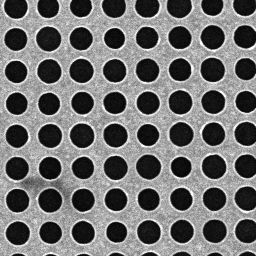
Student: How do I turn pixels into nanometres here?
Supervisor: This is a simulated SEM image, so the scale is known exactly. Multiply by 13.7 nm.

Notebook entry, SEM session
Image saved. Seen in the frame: a regular array of holes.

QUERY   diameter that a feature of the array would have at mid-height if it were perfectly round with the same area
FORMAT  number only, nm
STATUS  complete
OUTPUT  318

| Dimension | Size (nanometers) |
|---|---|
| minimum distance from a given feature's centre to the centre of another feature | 439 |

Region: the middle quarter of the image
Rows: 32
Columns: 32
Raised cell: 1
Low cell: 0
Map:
11000001110000011100000011000000
10000001110000001100000011000000
10000001110000001100000011000000
11000001110000011110000111100001
11100011111100111111001111111111
11111111111111111111111111111111
11111111111111111111111111111111
11100011111000111110000111100001
11000001110000011100000111000000
11000000110000001100000011000000
11000001110000001100000011000000
11000001111000011110000111100001
11110111111101111111001111110011
11111111111111111111111111111111
11111111111111111111111111111111
11100011111000011110001111100001
11000001110000011110000111000000
10000000110000001100000011000000
10000000110000001100000011000000
11000001110000001110000111100000
11100011111100111111101111110011
11111111111111111111111111111111
11111111111111111111111111111111
11110011111000011110000111110011
11000001110000001100000011100000
11000001110000001100000011100000
11000001110000001100000011100000
11000001110000001110000011100001
11110011111000011111000111111111
11111111111111111111111111111111
11111111111111111111111111111111
11110011111000111111001111110001